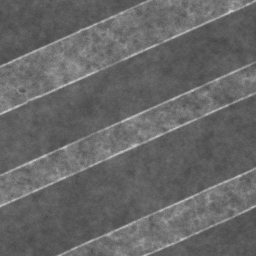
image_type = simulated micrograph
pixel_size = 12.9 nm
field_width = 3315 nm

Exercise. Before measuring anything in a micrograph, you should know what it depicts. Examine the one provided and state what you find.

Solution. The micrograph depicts one or a few lines or trenches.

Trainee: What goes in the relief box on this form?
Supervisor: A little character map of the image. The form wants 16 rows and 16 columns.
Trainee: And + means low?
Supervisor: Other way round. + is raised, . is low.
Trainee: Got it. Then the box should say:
........+++++++.
......+++++++...
....++++++......
.+++++++........
++++++.........+
++++........++++
+.........++++..
........++++....
......++++......
...+++++........
.++++...........
+++...........++
+...........++++
.........++++++.
.......+++++....
.....+++++......